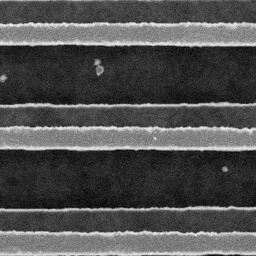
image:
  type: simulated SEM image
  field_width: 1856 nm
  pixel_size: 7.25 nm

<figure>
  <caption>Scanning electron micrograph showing lines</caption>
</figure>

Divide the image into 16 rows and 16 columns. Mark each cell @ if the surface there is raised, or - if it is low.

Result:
@@@@@@@@@@@@@@@@
@@@@@@@@@@@@@@@@
@@@@@@@@@@@@@@@@
----------------
----------------
----------------
---------------@
@@@@@@@@@@@@@@@@
@@@@@@@@@@@@@@@@
----------------
----------------
----------------
----------------
@@@@@@@@@@@@@@@@
@@@@@@@@@@@@@@@@
@@@@@@@@@@@@@@@@